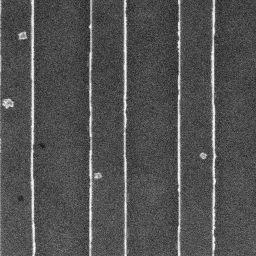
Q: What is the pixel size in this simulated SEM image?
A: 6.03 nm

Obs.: lines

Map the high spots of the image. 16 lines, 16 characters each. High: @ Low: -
@@----@@---@@---
@@----@@---@@---
@@----@@---@@---
@@----@@---@@---
@@----@@---@@---
@@----@@---@@---
@@----@@---@@---
@@----@@---@@---
@@----@@---@@---
@@----@@---@@---
@@----@@---@@---
@@----@@---@@---
@@----@@---@@---
@@----@@---@@---
@@----@@---@@---
@@----@@---@@---